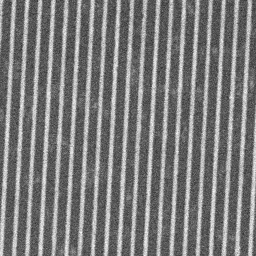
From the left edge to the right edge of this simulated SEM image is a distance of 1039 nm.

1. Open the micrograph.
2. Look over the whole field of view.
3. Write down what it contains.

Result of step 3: parallel lines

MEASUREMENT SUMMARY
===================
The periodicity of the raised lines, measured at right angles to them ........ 53.1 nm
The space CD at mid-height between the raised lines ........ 41.5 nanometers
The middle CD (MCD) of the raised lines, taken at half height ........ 9.6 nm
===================